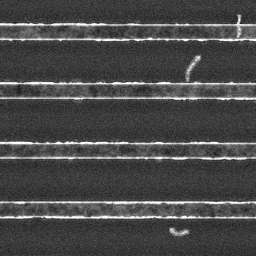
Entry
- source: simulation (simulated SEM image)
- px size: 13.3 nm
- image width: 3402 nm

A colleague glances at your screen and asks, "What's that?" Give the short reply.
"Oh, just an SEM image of lines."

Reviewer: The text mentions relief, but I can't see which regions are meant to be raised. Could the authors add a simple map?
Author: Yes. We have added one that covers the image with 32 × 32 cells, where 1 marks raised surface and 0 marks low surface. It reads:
00000000000000000000000000000000
00000000000000000000000000000000
00000000000000000000000000000000
11111111111111111111111111111111
11111111111111111111111111111111
00000000000000000000000000000000
00000000000000000000000000000000
00000000000000000000000000000000
00000000000000000000000000000000
00000000000000000000000000000000
11111111111111111111111111111111
11111111111111111111111111111111
00000000000000000000000000000000
00000000000000000000000000000000
00000000000000000000000000000000
00000000000000000000000000000000
00000000000000000000000000000000
00000000000000000000000000000000
11111111111111111111111111111111
11111111111111111111111111111111
00000000000000000000000000000000
00000000000000000000000000000000
00000000000000000000000000000000
00000000000000000000000000000000
00000000000000000000000000000000
11111111111111111111111111111111
11111111111111111111111111111111
00000000000000000000000000000000
00000000000000000000000000000000
00000000000000000000000000000000
00000000000000000000000000000000
00000000000000000000000000000000